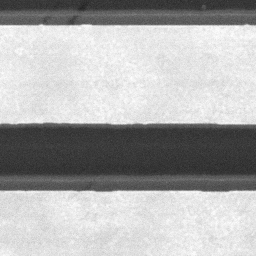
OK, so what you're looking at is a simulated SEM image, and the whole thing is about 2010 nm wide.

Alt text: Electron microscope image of lines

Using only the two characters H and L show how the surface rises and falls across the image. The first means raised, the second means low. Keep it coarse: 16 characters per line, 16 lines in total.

LLLLLLLLLLLLLLLL
HHHHHHHHHHHHHHHH
HHHHHHHHHHHHHHHH
HHHHHHHHHHHHHHHH
HHHHHHHHHHHHHHHH
HHHHHHHHHHHHHHHH
HHHHHHHHHHHHHHHH
HHHHHHHHHHHHHHHH
LLLLLLLLLLLLLLLL
LLLLLLLLLLLLLLLL
LLLLLLLLLLLLLLLL
HHHHHHHHHHHHHHHH
HHHHHHHHHHHHHHHH
HHHHHHHHHHHHHHHH
HHHHHHHHHHHHHHHH
HHHHHHHHHHHHHHHH